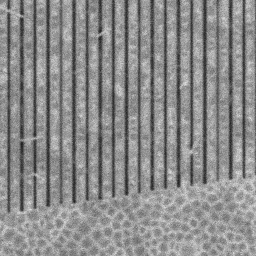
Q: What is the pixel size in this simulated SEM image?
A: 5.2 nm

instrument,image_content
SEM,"parallel lines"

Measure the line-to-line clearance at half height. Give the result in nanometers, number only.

15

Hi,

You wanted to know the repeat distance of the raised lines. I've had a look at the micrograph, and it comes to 0.0681 microns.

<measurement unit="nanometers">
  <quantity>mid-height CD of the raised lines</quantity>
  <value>48.8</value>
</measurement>